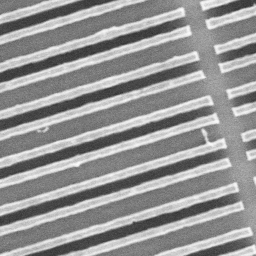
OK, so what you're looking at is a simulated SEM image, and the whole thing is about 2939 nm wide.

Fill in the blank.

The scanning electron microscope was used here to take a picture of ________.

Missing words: parallel lines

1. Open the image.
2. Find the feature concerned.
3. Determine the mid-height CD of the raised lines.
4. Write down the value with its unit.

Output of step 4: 85.2 nm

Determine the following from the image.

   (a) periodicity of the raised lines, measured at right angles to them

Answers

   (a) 262 nm